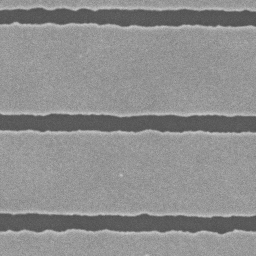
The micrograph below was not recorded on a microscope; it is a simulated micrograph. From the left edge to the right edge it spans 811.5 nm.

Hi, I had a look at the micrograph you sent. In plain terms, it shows lines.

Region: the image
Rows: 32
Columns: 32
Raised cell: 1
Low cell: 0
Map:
11111111111111111111111111111111
00000000000000000000000000000000
00000000000000000000000000000000
11111111111111111111111111111111
11111111111111111111111111111111
11111111111111111111111111111111
11111111111111111111111111111111
11111111111111111111111111111111
11111111111111111111111111111111
11111111111111111111111111111111
11111111111111111111111111111111
11111111111111111111111111111111
11111111111111111111111111111111
11111111111111111111111111111111
00000000000000111000000100001100
00000000000000000000000000000000
11111111111111111111110111000011
11111111111111111111111111111111
11111111111111111111111111111111
11111111111111111111111111111111
11111111111111111111111111111111
11111111111111111111111111111111
11111111111111111111111111111111
11111111111111111111111111111111
11111111111111111111111111111111
11111111111111111111111111111111
11111111111111111111111111111111
00000000000000000000000000000000
00000000000000000000000000000000
11111111111111111111111111111111
11111111111111111111111111111111
11111111111111111111111111111111